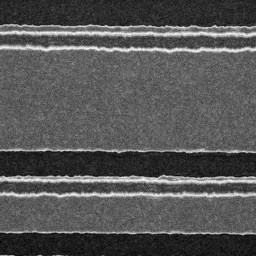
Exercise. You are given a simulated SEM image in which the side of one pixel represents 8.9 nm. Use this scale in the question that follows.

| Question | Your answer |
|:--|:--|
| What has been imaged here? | lines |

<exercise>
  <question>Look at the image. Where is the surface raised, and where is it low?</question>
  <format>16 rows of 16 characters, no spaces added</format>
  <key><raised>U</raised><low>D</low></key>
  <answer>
DDDDDDDDDDDDDDDD
DDDDDDDDDDDDDDDD
UUUUUUUUUUUUUUUU
UUUUUUUUUUUUUUUU
UUUUUUUUUUUUUUUU
UUUUUUUUUUUUUUUU
UUUUUUUUUUUUUUUU
UUUUUUUUUUUUUUUU
UUUUUUUUUUUUUUUU
DDDDDDDDDDDDDDUU
DDDDDDDDDDDDDDDD
UUUUUUUUUUUUUUUU
UUUUUUUUUUUUUUUU
UUUUUUUUUUUUUUUU
UUUUUUUUUUUUUUUU
DDDDDDDDDDDDDDDD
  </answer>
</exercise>